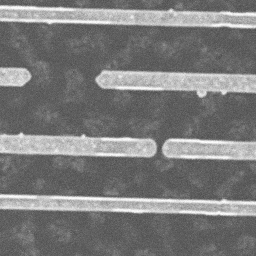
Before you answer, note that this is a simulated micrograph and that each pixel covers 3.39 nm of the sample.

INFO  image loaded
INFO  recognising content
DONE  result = one or a few lines or trenches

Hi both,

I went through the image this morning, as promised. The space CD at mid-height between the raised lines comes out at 0.16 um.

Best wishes